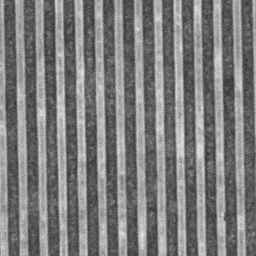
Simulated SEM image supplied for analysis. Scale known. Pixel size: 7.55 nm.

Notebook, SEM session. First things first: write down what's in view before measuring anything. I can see parallel lines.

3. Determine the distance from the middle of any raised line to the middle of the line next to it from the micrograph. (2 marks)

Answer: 149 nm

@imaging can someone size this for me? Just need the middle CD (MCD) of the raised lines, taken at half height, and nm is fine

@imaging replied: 59.4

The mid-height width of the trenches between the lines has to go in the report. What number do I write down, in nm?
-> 90.5